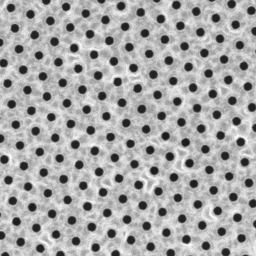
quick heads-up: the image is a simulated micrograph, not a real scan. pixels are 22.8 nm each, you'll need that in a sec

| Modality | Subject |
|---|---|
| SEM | a regular array of holes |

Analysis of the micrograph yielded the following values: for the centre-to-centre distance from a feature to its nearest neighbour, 473 nanometres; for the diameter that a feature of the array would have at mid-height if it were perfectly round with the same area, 9.03 pixels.